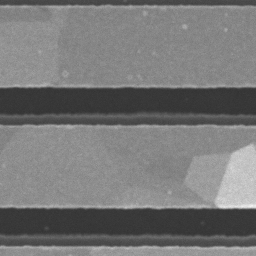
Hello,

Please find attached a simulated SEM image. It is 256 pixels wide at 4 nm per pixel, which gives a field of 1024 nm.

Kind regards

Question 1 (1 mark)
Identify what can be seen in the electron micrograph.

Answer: lines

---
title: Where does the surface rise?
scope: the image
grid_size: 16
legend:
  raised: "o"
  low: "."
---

oooooooooooooooo
oooooooooooooooo
oooooooooooooooo
oooooooooooooooo
oooooooooooooooo
................
................
................
oooooooooooooooo
oooooooooooooooo
oooooooooooooooo
oooooooooooooooo
oooooooooooooooo
................
................
oooooooooooooooo